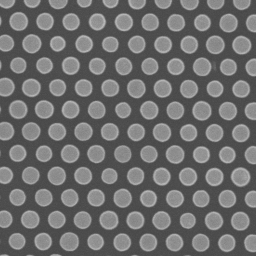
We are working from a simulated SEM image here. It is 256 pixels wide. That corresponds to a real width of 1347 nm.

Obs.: a regular array of raised bodies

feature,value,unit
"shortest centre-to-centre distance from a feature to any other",133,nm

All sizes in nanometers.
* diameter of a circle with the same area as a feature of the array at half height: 88.2